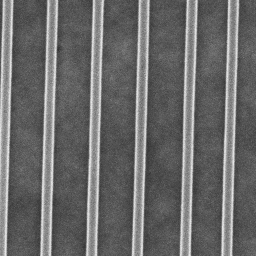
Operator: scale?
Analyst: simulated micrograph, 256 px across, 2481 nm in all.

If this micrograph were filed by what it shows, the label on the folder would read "parallel lines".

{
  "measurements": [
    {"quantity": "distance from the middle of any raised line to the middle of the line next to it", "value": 0.437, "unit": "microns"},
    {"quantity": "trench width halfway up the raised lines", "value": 351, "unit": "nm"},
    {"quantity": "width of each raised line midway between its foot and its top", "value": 92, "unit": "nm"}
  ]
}